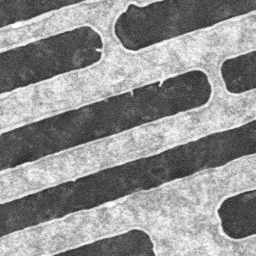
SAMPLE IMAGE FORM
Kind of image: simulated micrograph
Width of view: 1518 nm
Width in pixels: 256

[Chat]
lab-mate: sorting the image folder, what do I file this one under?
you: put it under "one or a few lines or trenches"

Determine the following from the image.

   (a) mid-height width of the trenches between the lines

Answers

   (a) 217 nanometres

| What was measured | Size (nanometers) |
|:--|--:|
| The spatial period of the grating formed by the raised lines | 406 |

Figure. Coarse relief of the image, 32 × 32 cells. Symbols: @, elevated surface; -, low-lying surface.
----------@@@@@@-@@-------------
------@@@@@@@@@-----------------
----@@@@@@@@@@@-------------@@@@
@@@@@@@@@---@@------------@@@@@@
@@@@@@-------@---------@@@@@@@@@
@@@----------@@-----@@@@@@@@@@@@
-------------@@@@@@@@@@@@@@@@@@-
------------@@@@@@@@@@@@@@@@----
-----------@@@@@@@@@@@@@@@@@----
-------@@@@@@@@@@@@@@@----@@----
----@@@@@@@@@@@@@@--------@@----
-@@@@@@@@@@@@@@@-----------@@--@
@@@@@@@@@@@@@-------------@@@@@@
@@@@@@@@@@---------------@@@@@@@
@@@@@@----------------@@@@@@@@@@
@@@---------------@@@@@@@@@@@@--
---------------@@@@@@@@@@@@-----
------------@@@@@@@@@@@@--------
---------@@@@@@@@@@@@-----------
------@@@@@@@@@@@@-------------@
---@@@@@@@@@@@@-------------@@@@
@@@@@@@@@@@@-------------@@@@@@@
@@@@@@@@@-------------@@@@@@@@@@
@@@@@@-------------@@@@@@@@@@@@@
@@@-------------@@@@@@@@@@@@@---
-------------@@@@@@@@@@@@@@-----
----------@@@@@@@@@@@@@@@@@-----
-------@@@@@@@@@@@@@@@@@@@@-----
----@@@@@@@@@@@@@@@@@@@@@@@@----
-@@@@@@@@@@@@@-----@@@@@@@@@---@
@@@@@@@@@@@--------@@@@@@@@@@@@@
@@@@@@@@-----------@@@@@@@@@@@@@